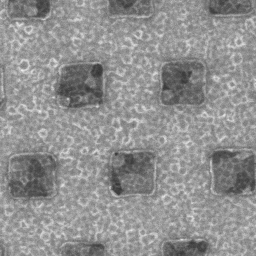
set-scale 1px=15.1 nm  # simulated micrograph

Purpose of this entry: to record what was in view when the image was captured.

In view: raised bodies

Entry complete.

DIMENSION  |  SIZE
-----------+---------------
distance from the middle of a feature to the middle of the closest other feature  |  1530 nm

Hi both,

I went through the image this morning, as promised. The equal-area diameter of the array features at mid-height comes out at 764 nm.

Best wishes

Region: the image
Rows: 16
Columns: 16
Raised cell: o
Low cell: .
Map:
ooo....ooo...ooo
................
................
................
....oo....ooo...
....ooo...ooo...
....oo....ooo...
................
................
.......oo....ooo
.oo....ooo...ooo
.oo....ooo...ooo
................
................
................
....oo....ooo...